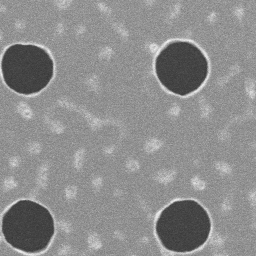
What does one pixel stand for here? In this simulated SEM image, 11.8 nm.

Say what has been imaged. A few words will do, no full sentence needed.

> holes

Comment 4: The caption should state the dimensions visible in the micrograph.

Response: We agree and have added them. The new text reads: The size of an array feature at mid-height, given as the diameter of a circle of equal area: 626 nanometers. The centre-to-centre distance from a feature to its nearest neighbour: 1840 nm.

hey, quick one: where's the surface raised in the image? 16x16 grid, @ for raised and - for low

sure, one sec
@@@@@@@@@@@@@@@@
@@@@@@@@@@@@@@@@
@@@@@@@@@@@@@@@@
---@@@@@@@---@@@
---@@@@@@@---@@@
@--@@@@@@@--@@@@
@@@@@@@@@@@@@@@@
@@@@@@@@@@@@@@@@
@@@@@@@@@@@@@@@@
@@@@@@@@@@@@@@@@
@@@@@@@@@@@@@@@@
@@@@@@@@@@@@@@@@
@@@@@@@@@@@@@@@@
---@@@@@@@---@@@
---@@@@@@@---@@@
@--@@@@@@@--@@@@